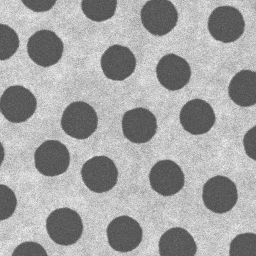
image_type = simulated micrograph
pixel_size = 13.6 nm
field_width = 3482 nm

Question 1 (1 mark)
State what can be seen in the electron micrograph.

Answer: a regular array of holes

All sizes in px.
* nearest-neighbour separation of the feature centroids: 55.7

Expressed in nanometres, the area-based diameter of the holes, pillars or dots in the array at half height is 499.